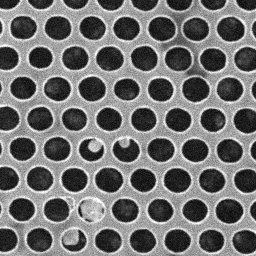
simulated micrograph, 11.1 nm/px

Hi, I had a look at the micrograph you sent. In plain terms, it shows a regular array of holes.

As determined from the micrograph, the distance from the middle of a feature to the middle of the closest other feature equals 378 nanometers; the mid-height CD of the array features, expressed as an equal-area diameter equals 0.286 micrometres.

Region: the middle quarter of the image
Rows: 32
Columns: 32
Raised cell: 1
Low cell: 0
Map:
00000011100000011000000111000000
11001111110001111110001111100011
11111111111111111111111111111111
11111000011111101111111001111110
01110000001110000011100000011100
00100000001110000001100000011100
00110000000100000001100000001000
00110000001110000001100000011100
01111000001111000011110000011100
11111100111111111111111101111111
11111111111111111111111111111111
00000111100001111100001111000011
00000011000000111000000111000001
00000011000000111000000110000000
00000011000000111000000110000000
00000111100000111000000111000000
10001111110001111100001111100001
11111111111111111111111111111111
11111100111111001111111001111111
01110000011110000011100000011100
00110001001100000001100000001100
00110000001100000001100000001000
00110000001100000001100000001000
01111000011110000011110000011100
11111101111111000111111101111111
11111111111111111111111111111111
00000111100001111100011111000011
00000011000000111000001110000001
00000011000000011000000110000000
00000011000000011000000110000000
00000011000000111000000110000000
10000111100000111100001111000001